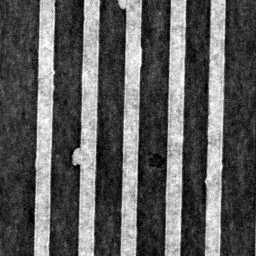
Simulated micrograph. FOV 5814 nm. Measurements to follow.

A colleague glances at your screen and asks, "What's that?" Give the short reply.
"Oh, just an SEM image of parallel lines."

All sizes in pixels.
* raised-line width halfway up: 13.7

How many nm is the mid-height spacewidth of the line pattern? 650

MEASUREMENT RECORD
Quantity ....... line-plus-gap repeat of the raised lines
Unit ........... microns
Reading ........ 0.97